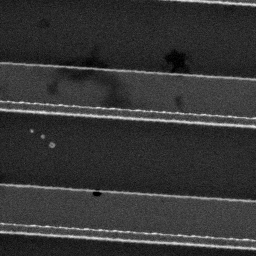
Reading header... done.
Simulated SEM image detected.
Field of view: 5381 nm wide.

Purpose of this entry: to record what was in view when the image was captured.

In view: lines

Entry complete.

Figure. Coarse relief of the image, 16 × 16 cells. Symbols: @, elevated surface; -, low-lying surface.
----------------
----------------
----------------
----------------
@@@@@@@@@-------
@@@@@@@@@@@@@@@@
@@@@@@@@@@@@@@@@
----------@@@@@@
----------------
----------------
----------------
----------------
@@@@@@@@@@@@@@--
@@@@@@@@@@@@@@@@
@@@@@@@@@@@@@@@@
---------------@